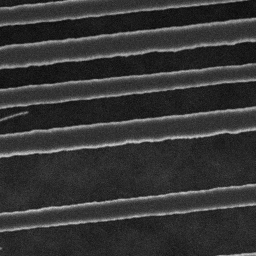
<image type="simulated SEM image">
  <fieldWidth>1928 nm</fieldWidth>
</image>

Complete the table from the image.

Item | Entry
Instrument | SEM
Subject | lines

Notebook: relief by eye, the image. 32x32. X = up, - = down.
----XXXXXXXXXXXXXXXXXXXXXX------
XXXXXXXXXXXXXXXXX---------------
XXXXXXXX---------------------XXX
---------------------XXXXXXXXXXX
------------XXXXXXXXXXXXXXXXXXXX
---XXXXXXXXXXXXXXXXXXXXXXXXXX---
XXXXXXXXXXXXXXXXXXX-------------
XXXXXXXXXXX---------------------
--------------------------XXXXXX
----------------XXXXXXXXXXXXXXXX
-------XXXXXXXXXXXXXXXXXXXX-----
XXXXXXXXXXXXXXXXXXX-------------
XXXXXXXXXX----------------------
------------------------------XX
---------------------XXXXXXXXXXX
------------XXXXXXXXXXXXXXXXXXXX
---XXXXXXXXXXXXXXXXXXXXXXXXXXX--
XXXXXXXXXXXXXXXXXXXX------------
XXXXXXXXXXX---------------------
X-------------------------------
--------------------------------
--------------------------------
--------------------------------
---------------------------XXXXX
-------------------XXXXXXXXXXXXX
-----------XXXXXXXXXXXXXXXXXXXXX
---XXXXXXXXXXXXXXXXXXXX---------
XXXXXXXXXXXXXX------------------
XXXX----------------------------
--------------------------------
--------------------------------
--------------------------------